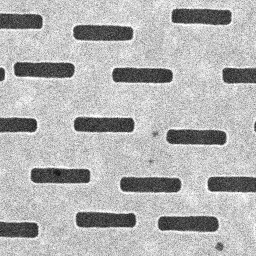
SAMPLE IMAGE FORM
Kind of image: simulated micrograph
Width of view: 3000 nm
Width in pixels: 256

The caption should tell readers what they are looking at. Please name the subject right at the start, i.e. a regular array of holes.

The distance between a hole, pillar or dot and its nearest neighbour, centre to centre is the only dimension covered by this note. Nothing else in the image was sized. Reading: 702 nanometres